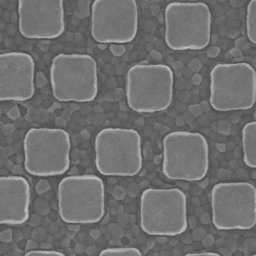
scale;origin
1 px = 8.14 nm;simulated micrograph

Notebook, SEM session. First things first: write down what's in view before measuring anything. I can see a regular array of raised bodies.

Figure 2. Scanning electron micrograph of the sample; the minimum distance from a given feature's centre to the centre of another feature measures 486 nanometers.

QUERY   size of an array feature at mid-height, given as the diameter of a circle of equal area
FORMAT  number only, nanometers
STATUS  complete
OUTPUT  401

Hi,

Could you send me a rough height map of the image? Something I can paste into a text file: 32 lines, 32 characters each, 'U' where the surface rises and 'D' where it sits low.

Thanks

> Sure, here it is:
DDUUUUUUDDDDUUUUUDDDDUUUUDDDDDDU
DDUUUUUUDDDDUUUUUDDDDUUUUUDDDDDU
DDDUUUUUDDDDUUUUUDDDDUUUUUDDDDDU
DDDUUUUUDDDDUUUUUDDDDUUUUUDDDDDU
DDDUUUUDDDDDUUUUUDDDDUUUUUDDDDDU
DDDDDDDDDDDDDDDDDDDDDUUUUUDDDDDD
DDDDDDDDDDDDDDDDDDDDDDDDDDDDDDDD
UUUUDDDUUUUUDDDDDDDDDDDDDDDDDDDD
UUUUDDUUUUUUDDDDDUUUUDDDDDDUUUUD
UUUUDDUUUUUUDDDDUUUUUUDDDDUUUUUU
UUUUDDUUUUUUDDDDUUUUUUDDDDDUUUUU
UUUUDDDUUUUUDDDDUUUUUDDDDDDUUUUU
DDDDDDDUUUUDDDDDUUUUUDDDDDUUUUUU
DDDDDDDDDDDDDDDDDUUUUDDDDDDUUUUD
DDDDDDDDDDDDDDDDDDDDDDDDDDDDDDDD
DDDDDDDDDDDDDDDDDDDDDDDDDDDDDDDU
DDDDUUUUDDDDDUUUUDDDDDDDDDDDDDUU
DDDUUUUUUDDDUUUUUDDDDUUUUUDDDDUU
DDDUUUUUUDDDUUUUUDDDDUUUUUDDDDUU
DDDUUUUUUDDDUUUUUDDDDUUUUUDDDDDU
DDDUUUUUUDDDUUUUUDDDUUUUUUDDDDDU
DDDDUUUUDDDDDUUUUDDDDUUUUUDDDDDD
UUUDDDDDUUUUUDDDDDDDDDDUUDDDDDDD
UUUUDDDUUUUUUDDDDDDDDDDDDDDUUUUU
UUUUDDDUUUUUUDDDDDUUUUUDDDDUUUUU
UUUUDDDUUUUUUDDDDDUUUUUDDDDUUUUU
UUUUDDDDUUUUUDDDDDUUUUUDDDDUUUUU
UUUDDDDDUUUUDDDDDDUUUUUDDDDUUUUU
DDDDDDDDDDDDDDDDDDUUUUUDDDDUUUUD
DDDDDDDDDDDDDDDDDDDDDDDDDDDDDDDD
DDDDDDDDDDDDDDDDDDDDDDDDDDDDDDDD
DDDDUUUDDDDDDUUUUDDDDDDDDDDDDDDD